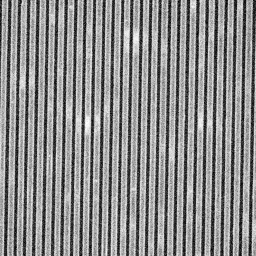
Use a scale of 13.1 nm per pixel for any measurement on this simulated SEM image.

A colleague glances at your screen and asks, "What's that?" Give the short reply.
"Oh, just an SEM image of parallel lines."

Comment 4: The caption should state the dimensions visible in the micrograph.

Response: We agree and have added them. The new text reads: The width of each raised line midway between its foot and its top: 67 nanometers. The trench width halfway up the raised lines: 53.9 nm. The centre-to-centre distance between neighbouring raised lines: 0.123 µm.